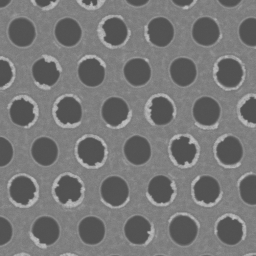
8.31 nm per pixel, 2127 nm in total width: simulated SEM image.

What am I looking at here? a regular array of holes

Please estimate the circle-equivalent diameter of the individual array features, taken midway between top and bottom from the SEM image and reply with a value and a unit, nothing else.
227 nanometers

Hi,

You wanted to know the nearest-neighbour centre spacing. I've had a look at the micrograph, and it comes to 45 pixels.